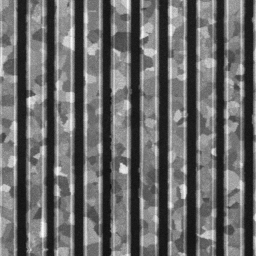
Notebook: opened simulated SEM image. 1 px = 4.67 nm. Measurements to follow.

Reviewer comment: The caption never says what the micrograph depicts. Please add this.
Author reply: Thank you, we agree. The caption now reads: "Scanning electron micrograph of parallel lines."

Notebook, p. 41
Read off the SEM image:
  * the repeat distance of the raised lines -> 132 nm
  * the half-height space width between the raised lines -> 67.7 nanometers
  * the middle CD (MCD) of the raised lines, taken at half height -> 67.7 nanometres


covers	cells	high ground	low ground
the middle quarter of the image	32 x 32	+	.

++....+++....+++....+++....+++..
++....+++....+++....+++....+++..
++....+++....+++....+++....+++..
++....+++....+++....+++....+++..
++....+++....+++....+++....+++..
++....+++....+++....+++....+++..
++....+++....+++....+++....+++..
++....+++....+++....+++....+++..
++....+++....+++....+++....+++..
++...++++....+++....+++....+++..
++....+++...++++....+++....+++..
++....+++...++++....+++....+++..
++....+++...++++....+++....+++..
++....+++...++++....+++....+++..
++....+++...++++....+++....+++..
++....+++...++++....+++....+++..
++....+++...++++....+++....+++..
++....+++...++++....+++....+++..
++....+++...++++....+++....+++..
++....+++...++++....+++....+++..
++....+++...++++....+++....+++..
++....+++...++++....+++....+++..
++....+++...++++....+++....+++..
++....+++...++++....+++....+++..
++....+++...++++....+++....+++..
++....+++...++++....+++....+++..
++....+++...++++....+++....+++..
++....+++....+++....+++....+++..
++....+++...++++....+++....+++..
++....+++...++++....+++....+++..
++...++++...++++....+++....+++..
++...++++...++++....+++....+++..